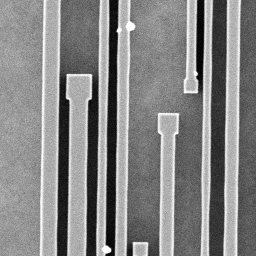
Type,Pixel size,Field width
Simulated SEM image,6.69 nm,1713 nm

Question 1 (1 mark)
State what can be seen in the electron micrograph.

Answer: groups of lines, slits or small figures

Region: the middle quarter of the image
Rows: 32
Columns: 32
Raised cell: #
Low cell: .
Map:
.........##...##...............#
.........##...##...............#
.........##...##...............#
.######..##...##..............##
.######..##...##..............##
.######..##...##..............##
.######..##...##..............##
.######..##...##................
.######..##...##................
.#####...##...##................
.#####...##...##................
.#####...##...##................
.#####...##..###........#####...
.#####...##..###........#####...
.#####...##..###........#####...
.#####...##..###........####....
.#####...##..###........####....
.#####...##..###........####....
.#####...##..###........####....
.#####...##..###........####....
.#####...##..###........####....
.#####...##..###........###.....
.#####...##..###........###.....
.#####...##..###........###.....
.#####...##..###........###.....
.#####...##..###........###.....
.####....##..###........###.....
.####....##..###........###.....
.####....##..###........###.....
.####....##..###........###.....
.####...##...###........###.....
.####...##...###........###.....